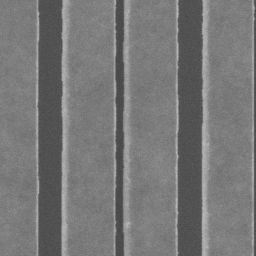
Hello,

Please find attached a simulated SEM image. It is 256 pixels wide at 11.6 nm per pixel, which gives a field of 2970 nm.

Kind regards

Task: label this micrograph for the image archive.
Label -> lines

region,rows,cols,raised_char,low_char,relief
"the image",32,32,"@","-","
@@@@@---@@@@@@--@@@@@@----@@@@@@
@@@@@---@@@@@@--@@@@@@----@@@@@@
@@@@@---@@@@@@--@@@@@@----@@@@@@
@@@@@---@@@@@@--@@@@@@---@@@@@@@
@@@@@---@@@@@@--@@@@@@---@@@@@@@
@@@@@---@@@@@@--@@@@@@----@@@@@@
@@@@@---@@@@@@--@@@@@@----@@@@@@
@@@@@---@@@@@@--@@@@@@----@@@@@@
@@@@@---@@@@@@--@@@@@@----@@@@@@
@@@@@---@@@@@@--@@@@@@----@@@@@@
@@@@@---@@@@@@--@@@@@@----@@@@@@
@@@@@---@@@@@@--@@@@@@----@@@@@@
@@@@@---@@@@@@--@@@@@@----@@@@@@
@@@@@---@@@@@@--@@@@@@----@@@@@@
@@@@@---@@@@@@--@@@@@@----@@@@@@
@@@@@---@@@@@@--@@@@@@----@@@@@@
@@@@@---@@@@@@--@@@@@@----@@@@@@
@@@@@---@@@@@@--@@@@@@----@@@@@@
@@@@@---@@@@@@--@@@@@@----@@@@@@
@@@@@---@@@@@@--@@@@@@----@@@@@@
@@@@@---@@@@@@--@@@@@@----@@@@@@
@@@@@---@@@@@@--@@@@@@----@@@@@@
@@@@@---@@@@@@--@@@@@@---@@@@@@@
@@@@@---@@@@@@--@@@@@@---@@@@@@@
@@@@@---@@@@@@--@@@@@@---@@@@@@@
@@@@@---@@@@@@--@@@@@@---@@@@@@@
@@@@@---@@@@@@--@@@@@@---@@@@@@@
@@@@@---@@@@@@--@@@@@@---@@@@@@@
@@@@@---@@@@@@--@@@@@@---@@@@@@@
@@@@@---@@@@@@--@@@@@@---@@@@@@@
@@@@@---@@@@@@--@@@@@@---@@@@@@@
@@@@@---@@@@@@--@@@@@@----@@@@@@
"